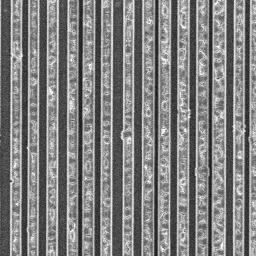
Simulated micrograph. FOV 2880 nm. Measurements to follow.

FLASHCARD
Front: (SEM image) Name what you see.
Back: parallel lines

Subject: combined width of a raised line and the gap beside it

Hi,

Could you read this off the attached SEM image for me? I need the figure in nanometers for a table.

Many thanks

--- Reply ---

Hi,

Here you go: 209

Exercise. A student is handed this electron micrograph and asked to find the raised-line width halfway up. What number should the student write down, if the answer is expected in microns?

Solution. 0.119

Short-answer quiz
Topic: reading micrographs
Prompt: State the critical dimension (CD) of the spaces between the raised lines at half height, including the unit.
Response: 87.2 nanometres